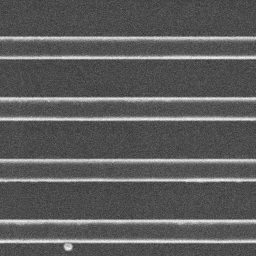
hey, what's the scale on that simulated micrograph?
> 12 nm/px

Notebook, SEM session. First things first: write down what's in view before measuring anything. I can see lines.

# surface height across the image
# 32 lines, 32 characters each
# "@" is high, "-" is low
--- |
--------------------------------
--------------------------------
--------------------------------
--------------------------------
--------------------------------
@@@@@@@@@@@@@@@@@@@@@@@@@@@@@@@@
@@@@@@@@@@@@@@@@@@@@@@@@@@@@@@@@
--------------------------------
--------------------------------
--------------------------------
--------------------------------
--------------------------------
@@@@@@@@@@@@@@@@@@@@@@@@@@@@@@@@
@@@@@@@@@@@@@@@@@@@@@@@@@@@@@@@@
@@@@@@@@@@@@@@@@@@@@@@@@@@@@@@@@
--------------------------------
--------------------------------
--------------------------------
--------------------------------
--------------------------------
@@@@@@@@@@@@@@@@@@@@@@@@@@@@@@@@
@@@@@@@@@@@@@@@@@@@@@@@@@@@@@@@@
@@@@@@@@@@@@@@@@@@@@@@@@@@---@@@
--------------------------------
--------------------------------
--------------------------------
--------------------------------
--------------------------------
@@@@@@@@@@@@@@@@@@@@@@@@@@@@@@@@
@@@@@@@@@@@@@@@@@@@@@@@@@@@@@@@@
--------------------------------
--------------------------------